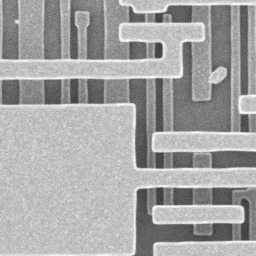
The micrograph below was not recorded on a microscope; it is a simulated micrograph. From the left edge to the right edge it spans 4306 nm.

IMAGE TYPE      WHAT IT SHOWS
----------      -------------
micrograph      wiring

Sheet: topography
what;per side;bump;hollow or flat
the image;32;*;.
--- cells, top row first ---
...............*****************
.................**.............
................................
...............**********.......
...............**********.......
....................***.........
....................***.........
..................*****.........
***********************.........
***********************.........
................................
................................
..............................**
*****************.............**
*****************...............
*****************...............
*****************...............
*****************..*************
*****************..*************
*****************...............
*****************...............
********************************
********************************
*******************.............
*****************...............
*****************...............
*****************..***********..
*****************..***********..
*****************...............
*****************...............
*****************..*************
*****************..*************